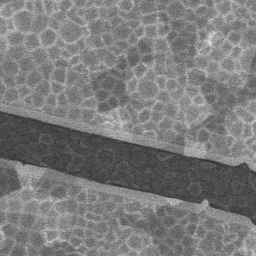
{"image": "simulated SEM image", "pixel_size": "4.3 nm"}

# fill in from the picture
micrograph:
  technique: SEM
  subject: one or a few lines or trenches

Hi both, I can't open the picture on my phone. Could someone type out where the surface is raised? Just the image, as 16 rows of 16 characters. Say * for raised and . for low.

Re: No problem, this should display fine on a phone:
****************
****************
****************
****************
****************
****************
****************
...*************
........********
............****
*...............
*****...........
**********......
**************..
****************
****************